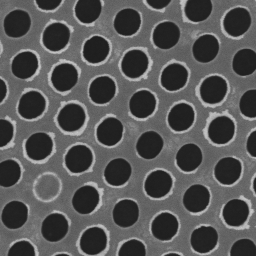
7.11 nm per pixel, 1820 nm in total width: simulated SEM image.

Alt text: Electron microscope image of a regular array of holes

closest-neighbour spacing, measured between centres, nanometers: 292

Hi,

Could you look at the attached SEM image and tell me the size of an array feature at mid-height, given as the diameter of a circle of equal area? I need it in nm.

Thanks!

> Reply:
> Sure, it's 189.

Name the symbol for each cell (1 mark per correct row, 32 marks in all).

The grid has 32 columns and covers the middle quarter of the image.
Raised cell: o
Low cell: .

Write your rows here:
..oooooooooooo.......ooooo...ooo
...oooooooooooo.....ooooo......o
...oooooooooooo.....ooooo......o
...ooooo...ooooooooooooo.......o
...oooo.....oooooooooooo......oo
..ooooo......oooooooooooo.....oo
.ooooo.......ooooooooooooo..oooo
oooooo.......ooooo....oooooooooo
ooooooo.....ooooo......ooooooooo
oooooooo...ooooo.......ooooooooo
o...oooooooooooo.......ooooo....
.....oooooooooooo.....ooooo.....
.....oooooooooooo.....oooo......
.....ooooooooooooooooooooo......
.....ooooo....oooooooooooo......
....ooooo......oooooooooooo.....
...ooooo.......ooooooooooooo..oo
oooooooo.......ooooo....oooooooo
oooooooo......ooooo.....oooooooo
ooooooooo.....oooo.......ooooooo
ooo..ooooooooooooo.......ooooo..
oo....oooooooooooo......ooooo...
o......oooooooooooo.....oooo....
.......ooooooooooooo..oooooo....
.......ooooo....oooooooooooo....
o.....ooooo......oooooooooooo...
o....ooooo.......ooooooooooooo..
oooooooooo.......ooooo....oooooo
oooooooooo......ooooo......ooooo
ooooooooooo....ooooo.......ooooo
oooooooooooooooooooo.......ooooo
oooo....oooooooooooo......ooooo.